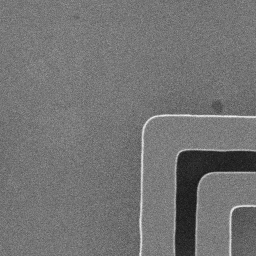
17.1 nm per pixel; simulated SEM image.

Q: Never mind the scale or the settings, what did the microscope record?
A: groups of lines, slits or small figures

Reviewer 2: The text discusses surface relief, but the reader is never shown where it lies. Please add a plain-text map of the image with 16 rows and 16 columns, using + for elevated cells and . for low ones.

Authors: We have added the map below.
................
................
................
................
................
................
................
.........+++++++
.........+++++++
.........+++....
.........++.....
.........++.++++
.........++.++++
.........++.++..
.........++.++..
.........++.++..